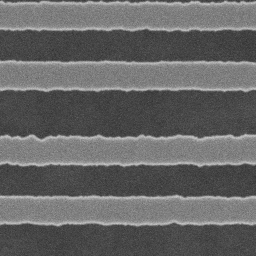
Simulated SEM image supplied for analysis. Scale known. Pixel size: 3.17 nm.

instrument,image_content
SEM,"lines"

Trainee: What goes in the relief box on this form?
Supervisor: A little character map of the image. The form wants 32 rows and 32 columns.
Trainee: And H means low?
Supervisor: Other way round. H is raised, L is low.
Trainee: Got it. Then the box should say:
HHHHHHHHHHHHHHHHHHHHHHHHHHHHHHHH
HHHHHHHHHHHHHHHHHHHHHHHHHHHHHHHH
HHHHHHHHHHHHHHHHHHHHHHHHHHHHHHHH
HHHHHHHHHHHHHHHHHHHHHHHHHHHHHHHH
LLLLLLLLLLLLLLLLLLLLLLLLLLLLLLLL
LLLLLLLLLLLLLLLLLLLLLLLLLLLLLLLL
LLLLLLLLLLLLLLLLLLLLLLLLLLLLLLLL
LLLLLLLLLLLLLLLLLLLLLLLLLLLLLLLL
HHHHHHHHHHHHHHHHHHHHHHHHHHHHHHHH
HHHHHHHHHHHHHHHHHHHHHHHHHHHHHHHH
HHHHHHHHHHHHHHHHHHHHHHHHHHHHHHHH
LLLLLLLLLLLLLLLLLLLLLLLLLLLLLLLL
LLLLLLLLLLLLLLLLLLLLLLLLLLLLLLLL
LLLLLLLLLLLLLLLLLLLLLLLLLLLLLLLL
LLLLLLLLLLLLLLLLLLLLLLLLLLLLLLLL
LLLLLLLLLLLLLLLLLLLLLLLLLLLLLLLL
LLLLLLLLLLLLLLLLLLLLLLLLLLLLLLLL
HHHHHHHHHHHHHHHHHHHHHHHHHHHHHHHH
HHHHHHHHHHHHHHHHHHHHHHHHHHHHHHHH
HHHHHHHHHHHHHHHHHHHHHHHHHHHHHHHH
LHHHHHHHHHHHHHHHHHHHHHHHHHHHHHLH
LLLLLLLLLLLLLLLLLLLLLLLLLLLLLLLL
LLLLLLLLLLLLLLLLLLLLLLLLLLLLLLLL
LLLLLLLLLLLLLLLLLLLLLLLLLLLLLLLL
LHLLLLLLLLLHLLLLLLLLLHLLLLLLLLLL
HHHHHHHHHHHHHHHHHHHHHHHHHHHHHHHH
HHHHHHHHHHHHHHHHHHHHHHHHHHHHHHHH
HHHHHHHHHHHHHHHHHHHHHHHHHHHHHHHH
LLLLLLLLLLLLLLLLLLLLLLLLLLLLLLLL
LLLLLLLLLLLLLLLLLLLLLLLLLLLLLLLL
LLLLLLLLLLLLLLLLLLLLLLLLLLLLLLLL
LLLLLLLLLLLLLLLLLLLLLLLLLLLLLLLL